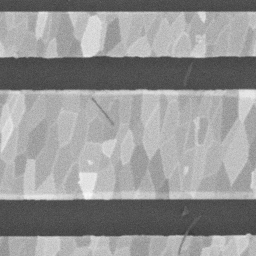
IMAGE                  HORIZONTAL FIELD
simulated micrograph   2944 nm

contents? lines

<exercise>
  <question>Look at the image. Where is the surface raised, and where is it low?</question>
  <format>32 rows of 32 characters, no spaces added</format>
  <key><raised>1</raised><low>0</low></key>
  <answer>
00000000000000000000000000000000
00000000000000000000000000000000
11111111111111111111111111111111
11111111111111111111111111111111
11111111111111111111111111111111
11111111111111111111111111111111
11111111111111111111111111111111
00000000000000000000000000000000
00000000000000000000000000000000
00000000000000000000000000000000
00000000000000000000000000000000
11111111111000111111100000000000
11111111111111111111111111111111
11111111111111111111111111111111
11111111111111111111111111111111
11111111111111111111111111111111
11111111111111111111111111111111
11111111111111111111111111111111
11111111111111111111111111111111
11111111111111111111111111111111
11111111111111111111111111111111
11111111111111111111111111111111
11111111111111111111111111111111
11111111111111111111111111111111
11111111111100000000100000000000
00000000000000000000000000000000
00000000000000000000000000000000
00000000000000000000000000000000
00000000000000000000000000000000
00000000000000000000000100000011
11111111111111111111111111111111
11111111111111111111111111111111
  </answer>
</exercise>